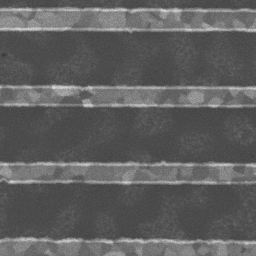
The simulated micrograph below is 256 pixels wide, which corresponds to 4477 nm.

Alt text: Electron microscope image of one or a few lines or trenches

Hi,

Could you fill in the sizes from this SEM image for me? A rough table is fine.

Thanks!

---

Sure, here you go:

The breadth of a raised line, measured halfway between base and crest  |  304 nanometres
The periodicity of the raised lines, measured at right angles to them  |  1340 nanometers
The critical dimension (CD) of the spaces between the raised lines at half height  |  1040 nm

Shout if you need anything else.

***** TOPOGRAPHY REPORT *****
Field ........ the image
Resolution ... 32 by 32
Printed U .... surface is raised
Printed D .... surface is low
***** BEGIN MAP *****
DDDDDDDDDDDDDDDDDDDDDDDDDDDDDDDD
UUUUUUUUUUUUUUUUUUUUUUUUUUUUUUUU
UUUUUUUUUUUUUUUUUUUUUUUUUUUUUUUU
UUUUDDDDDUUUUUUUUUUUUUUUUUUUUUUU
DDDDDDDDDDDDDDDDDDDDDDDDDDDDDDDD
DDDDDDDDDDDDDDDDDDDDDDDDDDDDDDDD
DDDDDDDDDDDDDDDDDDDDDDDDDDDDDDDD
DDDDDDDDDDDDDDDDDDDDDDDDDDDDDDDD
DDDDDDDDDDDDDDDDDDDDDDDDDDDDDDDD
DDDDDDDDDDDDDDDDDDDDDDDDDDDDDDDD
DDDDDDDDDDDDDDDDDDDDDDDDDDDDDDDD
UUUUUUUUUUUUUUUUUUUUUUUUUUUUUUUU
UUUUUUUUUUUUUUUUUUUUUUUUUUUUUUUU
DDDDDDDDDDDDDDDDDDDDDDDDDDDDDDDD
DDDDDDDDDDDDDDDDDDDDDDDDDDDDDDDD
DDDDDDDDDDDDDDDDDDDDDDDDDDDDDDDD
DDDDDDDDDDDDDDDDDDDDDDDDDDDDDDDD
DDDDDDDDDDDDDDDDDDDDDDDDDDDDDDDD
DDDDDDDDDDDDDDDDDDDDDDDDDDDDDDDD
DDDDDDDDDDDDDDDDDDDDDDDDDDDDDDDD
DDDDDDDDDDDDDDDDDDDDUDDDDDDDDDDD
UUUUUUUUUUUUUUUUUUUUUUUUUUUUUUUU
DUUUUUUUUUUUUUUUUUUUUUUUUUUUUUUU
DDDDDDDDDDDDDDDDDDDDDDDDDDDDDDDD
DDDDDDDDDDDDDDDDDDDDDDDDDDDDDDDD
DDDDDDDDDDDDDDDDDDDDDDDDDDDDDDDD
DDDDDDDDDDDDDDDDDDDDDDDDDDDDDDDD
DDDDDDDDDDDDDDDDDDDDDDDDDDDDDDDD
DDDDDDDDDDDDDDDDDDDDDDDDDDDDDDDD
DDDDDDDDDDDDDDDDDDDDDDDDDDDDDDDD
UUUUUUUUUUUUUUUUUUUUUUUUUUUUUUUU
UUUUUUUUUUUUUUUUUUUUUUUUUUUUUUUU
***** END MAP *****